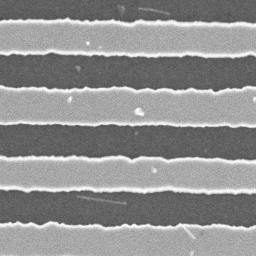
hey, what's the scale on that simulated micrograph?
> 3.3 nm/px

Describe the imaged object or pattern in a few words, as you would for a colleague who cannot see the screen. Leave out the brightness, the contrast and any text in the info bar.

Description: lines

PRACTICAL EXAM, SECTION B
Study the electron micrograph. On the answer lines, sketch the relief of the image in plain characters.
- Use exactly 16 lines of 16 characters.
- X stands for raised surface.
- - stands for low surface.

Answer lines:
----------------
XXXXXXXXXXXXXXXX
XXXXXXXXXXXXXXXX
--------XXXXXXX-
----------------
XXX----X-------X
XXXXXXXXXXXXXXXX
XXXXXXXXXXXXXXXX
----------------
----------------
XXXXXXXXXXXXXXXX
XXXXXXXXXXXXXXXX
----------------
----------------
XXXXXXXXXXXXXXXX
XXXXXXXXXXXXXXXX